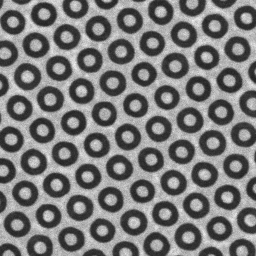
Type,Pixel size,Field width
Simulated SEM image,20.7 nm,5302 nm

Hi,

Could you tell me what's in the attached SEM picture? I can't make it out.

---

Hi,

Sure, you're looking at a regular array of ring-shaped grooves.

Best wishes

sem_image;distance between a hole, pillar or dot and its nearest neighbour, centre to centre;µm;0.662